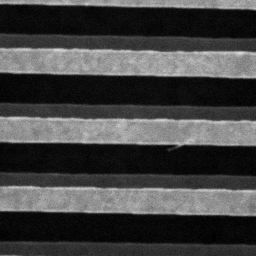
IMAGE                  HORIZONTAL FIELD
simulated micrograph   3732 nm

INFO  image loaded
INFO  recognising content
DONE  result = lines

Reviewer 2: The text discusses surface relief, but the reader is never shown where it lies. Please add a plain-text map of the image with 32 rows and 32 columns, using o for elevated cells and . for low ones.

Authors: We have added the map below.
.....ooooooooooooooooooooooooooo
................................
................................
................................
oooooooo........................
oooooooooooooooooooooooooooooooo
oooooooooooooooooooooooooooooooo
oooooooooooooooooooooooooooooooo
oooooooooooooooooooooooooooooooo
..........................oooooo
................................
................................
................................
oooooooooooooooooooooooooooooooo
oooooooooooooooooooooooooooooooo
oooooooooooooooooooooooooooooooo
oooooooooooooooooooooooooooooooo
oooooooooooooooooooooooooooooooo
................................
................................
................................
................................
oooooooooooooooooooooooooooooooo
oooooooooooooooooooooooooooooooo
oooooooooooooooooooooooooooooooo
oooooooooooooooooooooooooooooooo
..........oooooooooooooooooooooo
................................
................................
................................
oooooooooooooo..o...............
oooooooooooooooooooooooooooooooo